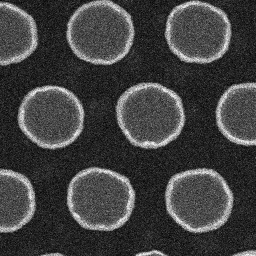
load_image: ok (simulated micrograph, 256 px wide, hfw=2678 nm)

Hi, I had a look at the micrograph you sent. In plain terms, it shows raised bodies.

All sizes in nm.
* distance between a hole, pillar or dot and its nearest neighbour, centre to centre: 1000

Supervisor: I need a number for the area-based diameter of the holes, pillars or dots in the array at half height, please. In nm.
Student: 652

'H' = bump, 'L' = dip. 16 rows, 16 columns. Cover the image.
HLLLLHHLLLLHHLLL
HHLLHHHHLLLHHHLL
HHLLHHHHLLLHHHLL
HLLLLHHHLLLHHHLL
LLLLLLLLLLLLLLLL
LLLHLLLLLHLLLLLH
LHHHHLLLHHHLLLHH
LHHHHLLHHHHLLLHH
LLHHHLLLHHHLLLHH
LLLLLLLLLLLLLLLL
LLLLLLLLLLLLLLLL
HHLLHHHHLLLHHHLL
HHLLHHHHLLLHHHLL
HHLLLHHHLLLHHHLL
LLLLLLLLLLLLLLLL
LLLLLLLLLLLLLLLL